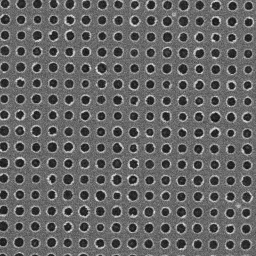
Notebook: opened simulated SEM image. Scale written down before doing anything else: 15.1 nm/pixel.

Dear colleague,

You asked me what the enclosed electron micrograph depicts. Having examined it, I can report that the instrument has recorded a regular array of holes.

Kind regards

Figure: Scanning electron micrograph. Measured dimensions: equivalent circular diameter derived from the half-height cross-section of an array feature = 0.135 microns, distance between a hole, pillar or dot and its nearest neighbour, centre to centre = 237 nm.